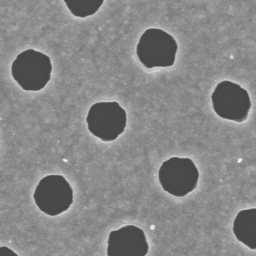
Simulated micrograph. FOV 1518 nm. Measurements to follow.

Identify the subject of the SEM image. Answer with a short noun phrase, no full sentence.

holes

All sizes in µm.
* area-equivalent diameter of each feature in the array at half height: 0.234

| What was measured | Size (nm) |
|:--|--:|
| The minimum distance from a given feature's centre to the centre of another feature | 537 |